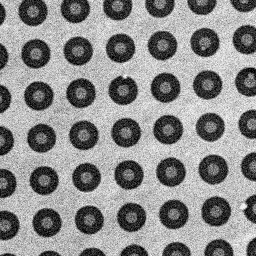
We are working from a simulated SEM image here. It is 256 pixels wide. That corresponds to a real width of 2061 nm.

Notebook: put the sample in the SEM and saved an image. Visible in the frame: an array of small figures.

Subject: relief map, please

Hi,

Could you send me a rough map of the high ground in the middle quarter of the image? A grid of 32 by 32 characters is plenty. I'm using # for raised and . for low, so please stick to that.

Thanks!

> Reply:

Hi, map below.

###.############################
################################
########################...#####
#############....#####......####
##.....#####......####.......###
#.......###...##..####..###..###
#..##...###...##...###..##...###
...##...###...##..####.......###
#.......####......#####.....####
#......######....#######...#####
##....##########################
################################
################################
###############.########....####
###....######.....#####......###
##......####.......###...##...##
#.......####..###..###...##...##
#...##...###..###..###...##...##
#...##...###.......####......###
##......####.......#####....####
##......######...###############
####..##########################
################################
##########################..####
##############....######.....###
###.....#####......####.......##
##.......####...#...###...##...#
##...##..###...##...###...##...#
##..###..####..##...###.......##
##...#...####.......####......##
##.......#####.....######...####
###.....########.###############